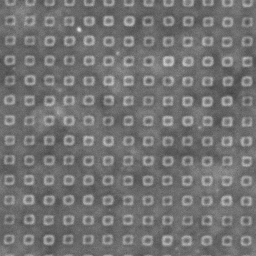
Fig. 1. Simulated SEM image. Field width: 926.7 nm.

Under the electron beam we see a regular array of raised bodies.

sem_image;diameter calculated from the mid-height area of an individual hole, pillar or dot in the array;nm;35.4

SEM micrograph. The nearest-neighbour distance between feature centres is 70.8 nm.